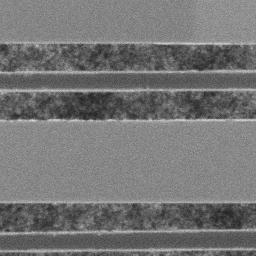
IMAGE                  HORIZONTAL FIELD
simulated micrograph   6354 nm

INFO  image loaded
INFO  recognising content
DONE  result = lines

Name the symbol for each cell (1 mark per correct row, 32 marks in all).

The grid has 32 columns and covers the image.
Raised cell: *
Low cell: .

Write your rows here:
********************************
********************************
********************************
********************************
********************************
................................
................................
................................
................................
********************************
********************************
................................
................................
................................
................................
********************************
********************************
********************************
********************************
********************************
********************************
********************************
********************************
********************************
********************************
................................
................................
................................
................................
********************************
********************************
................................